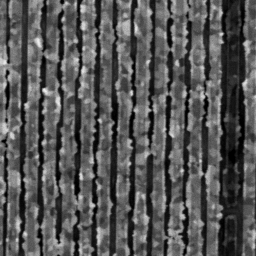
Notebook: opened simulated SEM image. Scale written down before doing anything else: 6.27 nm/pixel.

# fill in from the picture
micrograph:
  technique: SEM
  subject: parallel lines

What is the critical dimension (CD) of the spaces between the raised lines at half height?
37.6 nm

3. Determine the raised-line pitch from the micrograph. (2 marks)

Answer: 114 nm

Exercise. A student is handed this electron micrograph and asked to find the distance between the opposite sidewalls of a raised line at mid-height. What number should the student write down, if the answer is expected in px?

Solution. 12.7